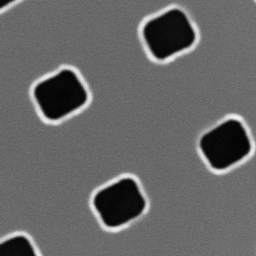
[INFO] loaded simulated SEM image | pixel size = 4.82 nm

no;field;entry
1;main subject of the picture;holes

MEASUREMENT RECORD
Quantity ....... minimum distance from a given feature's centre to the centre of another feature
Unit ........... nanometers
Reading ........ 588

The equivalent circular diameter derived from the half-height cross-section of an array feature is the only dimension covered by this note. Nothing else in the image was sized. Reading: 228 nanometres